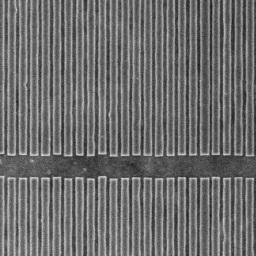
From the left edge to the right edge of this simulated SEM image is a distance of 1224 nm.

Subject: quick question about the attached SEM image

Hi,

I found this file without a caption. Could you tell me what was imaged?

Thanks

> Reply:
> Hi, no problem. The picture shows parallel lines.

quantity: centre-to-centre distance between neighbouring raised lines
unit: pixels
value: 11.3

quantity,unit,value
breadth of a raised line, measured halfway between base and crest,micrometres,0.0382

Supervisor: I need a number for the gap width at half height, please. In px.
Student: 3.24